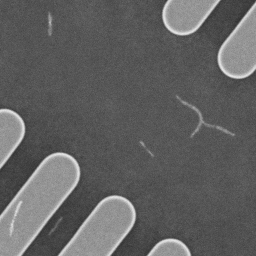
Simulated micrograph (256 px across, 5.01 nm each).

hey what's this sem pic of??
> groups of lines, slits or small figures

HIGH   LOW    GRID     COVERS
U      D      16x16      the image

DDDDDDDDDDUUUDDD
DDDDDDDDDDUUUDDU
DDDDDDDDDDDDDDUU
DDDDDDDDDDDDDDUU
DDDDDDDDDDDDDDUU
DDDDDDDDDDDDDDDD
DDDDDDDDDDDDDDDD
UDDDDDDDDDDDDDDD
UDDDDDDDDDDDDDDD
UDDDDDDDDDDDDDDD
DDUUUDDDDDDDDDDD
DDUUUDDDDDDDDDDD
DUUUDDUUDDDDDDDD
UUUDDDUUDDDDDDDD
UUDDDUUUDDDDDDDD
UUDDUUUDDDUUDDDD